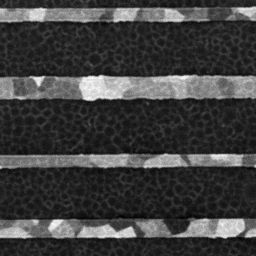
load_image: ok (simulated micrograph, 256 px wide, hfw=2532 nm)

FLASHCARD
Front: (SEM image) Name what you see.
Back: one or a few lines or trenches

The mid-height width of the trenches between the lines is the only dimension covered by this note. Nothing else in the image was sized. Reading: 544 nanometres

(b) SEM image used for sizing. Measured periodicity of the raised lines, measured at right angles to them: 703 nm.